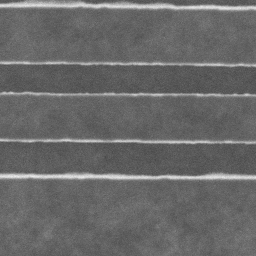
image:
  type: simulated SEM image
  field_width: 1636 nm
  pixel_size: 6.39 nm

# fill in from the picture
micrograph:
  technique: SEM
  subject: lines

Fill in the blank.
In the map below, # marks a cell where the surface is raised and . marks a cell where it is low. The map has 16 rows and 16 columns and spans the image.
##############..
################
################
################
................
................
################
################
################
................
................
################
################
################
################
################